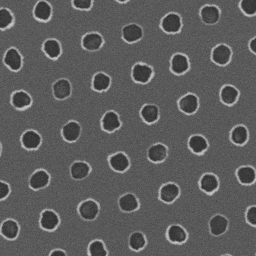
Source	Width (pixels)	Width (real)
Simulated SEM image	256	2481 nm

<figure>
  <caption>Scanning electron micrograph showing a regular array of holes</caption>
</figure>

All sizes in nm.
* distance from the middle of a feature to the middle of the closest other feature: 386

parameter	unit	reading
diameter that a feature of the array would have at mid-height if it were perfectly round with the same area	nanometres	172